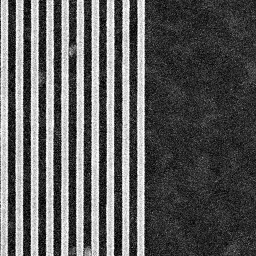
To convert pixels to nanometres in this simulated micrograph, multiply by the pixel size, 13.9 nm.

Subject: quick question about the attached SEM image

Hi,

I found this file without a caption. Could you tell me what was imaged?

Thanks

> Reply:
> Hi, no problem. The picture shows parallel lines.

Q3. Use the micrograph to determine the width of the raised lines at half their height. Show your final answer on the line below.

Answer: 0.0901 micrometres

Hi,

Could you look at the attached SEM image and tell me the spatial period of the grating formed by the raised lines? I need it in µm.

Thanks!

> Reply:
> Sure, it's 0.211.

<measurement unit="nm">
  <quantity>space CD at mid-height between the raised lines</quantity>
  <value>120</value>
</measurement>